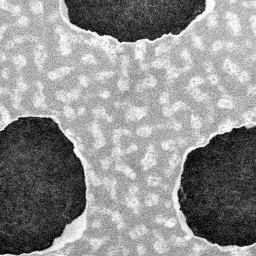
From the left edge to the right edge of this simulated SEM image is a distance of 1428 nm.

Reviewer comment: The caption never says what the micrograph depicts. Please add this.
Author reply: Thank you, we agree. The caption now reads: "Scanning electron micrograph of holes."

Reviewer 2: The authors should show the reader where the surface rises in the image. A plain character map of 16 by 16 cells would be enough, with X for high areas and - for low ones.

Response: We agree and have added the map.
XXXX---------XXX
XXXXX-------XXXX
XXXXXXX--XXXXXXX
XXXXXXXXXXXXXXXX
XXXXXXXXXXXXXXXX
XXXXXXXXXXXXXXXX
XXXXXXXXXXXXXXXX
X--XXXXXXXXXXXXX
----XXXXXXXXX---
-----XXXXXXX----
-----XXXXXX-----
-----XXXXXX-----
-----XXXXXX-----
-----XXXXXX-----
----XXXXXXXX----
---XXXXXXXXXXX-X